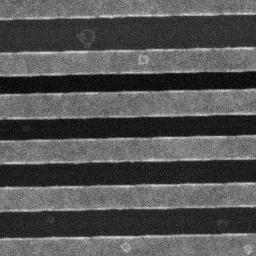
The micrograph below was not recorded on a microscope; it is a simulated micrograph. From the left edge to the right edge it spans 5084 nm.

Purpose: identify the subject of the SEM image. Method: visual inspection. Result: lines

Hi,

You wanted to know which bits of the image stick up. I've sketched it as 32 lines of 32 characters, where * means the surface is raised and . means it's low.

********************************
********************************
................................
................................
................................
................................
........************************
********************************
********************************
................................
................................
...............*****************
********************************
********************************
*********************...........
................................
................................
.........***********************
********************************
********************************
................................
................................
................................
********************************
********************************
********************************
................................
................................
................................
......................**********
********************************
********************************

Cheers